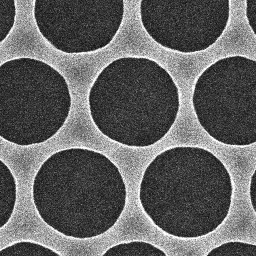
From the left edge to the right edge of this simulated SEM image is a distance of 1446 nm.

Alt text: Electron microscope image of holes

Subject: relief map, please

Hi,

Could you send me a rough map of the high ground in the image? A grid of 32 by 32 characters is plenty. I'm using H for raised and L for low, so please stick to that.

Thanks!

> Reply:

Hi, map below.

LLHHLLLLLLLLLLLHHHLLLLLLLLLLLHHL
LLHHLLLLLLLLLLLHHHLLLLLLLLLLLHHL
LLHHLLLLLLLLLLLHHHLLLLLLLLLLLHHL
LHHHHLLLLLLLLLLHHHLLLLLLLLLLHHHL
LHHHHLLLLLLLLLHHHHHLLLLLLLLHHHHH
HHHHHHLLLLLLLLHHHHHHLLLLLLLHHHHH
HHHHHHHHLLLHHHHHHHHHHHHLHHHHHHHH
HHLLLHHHHHHHHHHLLLLHHHHHHHHLLLLL
LLLLLLLHHHHHHLLLLLLLHHHHHHLLLLLL
LLLLLLLLHHHHLLLLLLLLLHHHHLLLLLLL
LLLLLLLLHHHHLLLLLLLLLLHHLLLLLLLL
LLLLLLLLLHHLLLLLLLLLLLHHLLLLLLLL
LLLLLLLLLHHLLLLLLLLLLLHHLLLLLLLL
LLLLLLLLLHHLLLLLLLLLLLHHLLLLLLLL
LLLLLLLLHHHLLLLLLLLLLLHHHLLLLLLL
LLLLLLLLHHHHLLLLLLLLLLHHHLLLLLLL
LLLLLLLHHHHHHLLLLLLLLHHHHHLLLLLL
HLLLLLHHHHHHHHLLLLLLHHHHHHHLLLLL
HHHHHHHHHLHHHHHHHHHHHLLLLHHHHHHH
HHHHHHLLLLLLLHHHHHHHLLLLLLLHHHHH
LHHHHLLLLLLLLLHHHHHLLLLLLLLLHHHH
LHHHHLLLLLLLLLLHHHLLLLLLLLLLLHHH
LLHHLLLLLLLLLLLHHHLLLLLLLLLLLHHL
LLHHLLLLLLLLLLLLHHLLLLLLLLLLLHHL
LLHHLLLLLLLLLLLLHLLLLLLLLLLLLHHL
LLHHLLLLLLLLLLLLHHLLLLLLLLLLLHHL
LLHHHLLLLLLLLLLHHHLLLLLLLLLLLHHH
LHHHHLLLLLLLLLLHHHHLLLLLLLLLHHHH
HHHHHHHLLLLLLLHHHHHHLLLLLLLHHHHH
HHHHHHHHLLLLHHHHHHHHHHLLLHHHHHHH
HHLLLHHHHHHHHHHLLLLHHHHHHHHHLLLH
LLLLLLLHHHHHHLLLLLLLHHHHHHLLLLLL